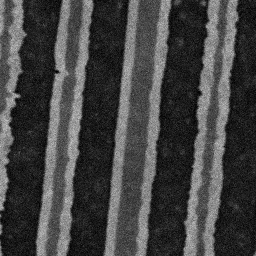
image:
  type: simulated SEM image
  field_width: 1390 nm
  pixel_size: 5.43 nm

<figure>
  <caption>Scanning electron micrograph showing one or a few lines or trenches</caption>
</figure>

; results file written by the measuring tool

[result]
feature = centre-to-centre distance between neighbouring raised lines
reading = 0.397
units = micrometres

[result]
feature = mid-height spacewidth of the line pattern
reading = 255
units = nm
